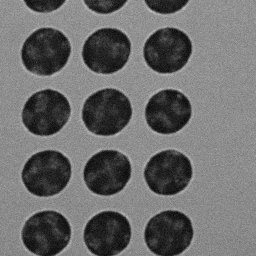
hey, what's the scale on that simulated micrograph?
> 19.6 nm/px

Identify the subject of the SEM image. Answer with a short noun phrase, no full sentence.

a regular array of holes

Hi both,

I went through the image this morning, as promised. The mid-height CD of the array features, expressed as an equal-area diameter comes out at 938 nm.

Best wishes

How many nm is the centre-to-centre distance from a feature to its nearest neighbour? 1190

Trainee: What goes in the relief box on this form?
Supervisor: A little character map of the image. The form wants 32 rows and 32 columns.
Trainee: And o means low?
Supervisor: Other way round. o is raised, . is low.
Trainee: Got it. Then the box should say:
ooo.....ooo.....oo.....ooooooooo
ooooo.oooooo..ooooo...oooooooooo
oooooooooooooooooooooooooooooooo
ooooo..oooooo.oooooo..oooooooooo
oooo....ooo.....ooo....ooooooooo
ooo......o......oo......oooooooo
ooo......o......oo......oooooooo
ooo.....oo......oo......oooooooo
ooo.....ooo....oooo....ooooooooo
ooooo.oooooooooooooooooooooooooo
oooooooooooooooooooooooooooooooo
ooooo..ooooo...ooooo...ooooooooo
ooo.....ooo.....ooo.....oooooooo
ooo......o......oo......oooooooo
ooo......o......oo......oooooooo
ooo.....ooo.....oo.....ooooooooo
oooo...oooo....oooo...oooooooooo
oooooooooooooooooooooooooooooooo
oooooooooooooooooooooooooooooooo
oooo....ooo.....ooo....ooooooooo
ooo......oo.....oo......oooooooo
ooo......o......oo......oooooooo
ooo......o......oo......oooooooo
ooo.....ooo....oooo....ooooooooo
ooooo..oooooo.oooooooooooooooooo
oooooooooooooooooooooooooooooooo
ooooo..oooooo..ooooo...ooooooooo
ooo.....ooo.....ooo.....oooooooo
ooo......oo.....oo......oooooooo
ooo......o......oo......oooooooo
ooo......oo.....oo......oooooooo
oooo....ooo....oooo....ooooooooo